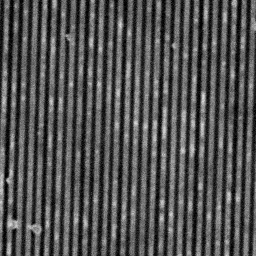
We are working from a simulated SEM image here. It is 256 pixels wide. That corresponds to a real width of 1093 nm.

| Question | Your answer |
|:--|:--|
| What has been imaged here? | parallel lines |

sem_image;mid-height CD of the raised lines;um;0.0181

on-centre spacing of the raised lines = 40.4 nm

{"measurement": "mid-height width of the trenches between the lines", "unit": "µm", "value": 0.0219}